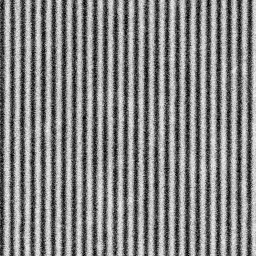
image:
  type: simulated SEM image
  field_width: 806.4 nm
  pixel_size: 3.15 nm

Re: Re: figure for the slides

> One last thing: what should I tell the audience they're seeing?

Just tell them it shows parallel lines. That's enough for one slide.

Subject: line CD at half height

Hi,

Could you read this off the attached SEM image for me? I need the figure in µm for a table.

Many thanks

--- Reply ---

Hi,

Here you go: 0.015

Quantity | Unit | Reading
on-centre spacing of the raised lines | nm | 32.5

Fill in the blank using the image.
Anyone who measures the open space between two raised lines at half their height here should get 18.1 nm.